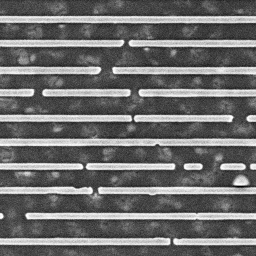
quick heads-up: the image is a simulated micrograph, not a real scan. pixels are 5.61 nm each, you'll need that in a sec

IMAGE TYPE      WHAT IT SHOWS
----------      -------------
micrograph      parallel lines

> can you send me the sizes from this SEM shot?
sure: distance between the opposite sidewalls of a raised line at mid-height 31.5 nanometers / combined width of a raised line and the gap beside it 24.6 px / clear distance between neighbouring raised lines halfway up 104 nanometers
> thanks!